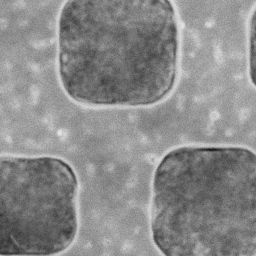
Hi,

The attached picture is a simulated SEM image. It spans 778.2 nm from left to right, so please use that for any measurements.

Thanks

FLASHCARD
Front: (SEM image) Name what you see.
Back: holes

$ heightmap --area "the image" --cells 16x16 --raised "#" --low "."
####.......#####
####.......#####
####.......#####
####.......#####
####.......#####
####.......#####
######...#######
################
################
###########.....
....######......
.....#####......
.....#####......
.....####.......
.....#####......
....######......